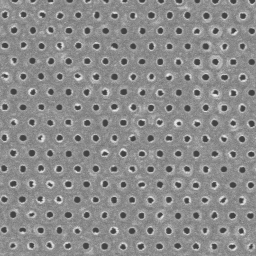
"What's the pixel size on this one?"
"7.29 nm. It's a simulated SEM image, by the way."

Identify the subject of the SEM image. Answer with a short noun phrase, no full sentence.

a regular array of holes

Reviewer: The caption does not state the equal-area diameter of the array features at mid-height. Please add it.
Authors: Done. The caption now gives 43.5 nanometres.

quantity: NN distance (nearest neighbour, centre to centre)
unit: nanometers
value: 127